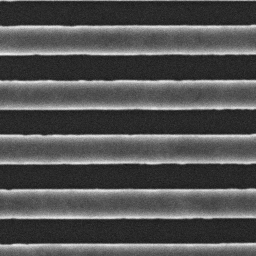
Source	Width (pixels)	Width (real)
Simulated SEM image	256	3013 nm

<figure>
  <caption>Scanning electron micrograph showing lines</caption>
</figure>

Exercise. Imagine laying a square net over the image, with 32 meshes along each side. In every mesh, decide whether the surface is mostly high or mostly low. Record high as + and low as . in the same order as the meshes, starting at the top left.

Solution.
................................
................................
................................
++++++++++++++++++++++++++++++++
++++++++++++++++++++++++++++++++
++++++++++++++++++++++++++++++++
++++++++++++++++++++++++++++++++
................................
................................
................................
++++++++++++++++++++++++++++++++
++++++++++++++++++++++++++++++++
++++++++++++++++++++++++++++++++
++++++++++++++++++++++++++++++++
................................
................................
................................
++++++++++++++++++++++++++++++++
++++++++++++++++++++++++++++++++
++++++++++++++++++++++++++++++++
................................
................................
................................
................................
++++++++++++++++++++++++++++++++
++++++++++++++++++++++++++++++++
++++++++++++++++++++++++++++++++
................................
................................
................................
...............................+
++++++++++++++++++++++++++++++++